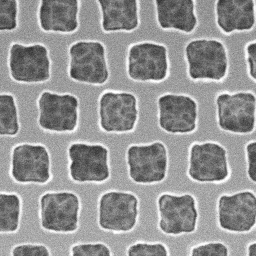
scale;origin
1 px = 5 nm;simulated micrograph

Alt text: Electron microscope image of a regular array of holes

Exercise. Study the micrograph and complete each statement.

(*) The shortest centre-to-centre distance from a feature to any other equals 57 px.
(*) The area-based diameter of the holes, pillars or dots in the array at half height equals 206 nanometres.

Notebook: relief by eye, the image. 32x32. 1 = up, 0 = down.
00111000001100000110000011100000
00111000001110000111000011100000
00111000001110000111000011100000
00111000011110000111100011110001
11111111111111111111111111111111
11111111100001111001111100001110
10000011100001110000011000001110
10000011100001110000011000001110
10000011100001110000011100001110
11000011100001110000011100001110
11111111111111111111111111111111
11111111111111111111111111111111
00111000001110000111000011100000
00111000001100000111000001100000
00111000001110000111000001100000
00111000011110000111000011100000
00111111111111111111100011111001
11111111111111111111111111111111
11000011100001110000011100001110
11000011100001110000011100001110
11000011100001110000011100001110
10000011100000110000011100000110
11000011100001111000111100001111
11111111111111111111111111111111
00111000011110000111000011111000
00011000001100000111000011100000
00011000001100000111000001100000
00111000001100000111000001100000
00111100011110001111000011110001
11111111111111111111111111111111
11111111111001111000111111001110
11000011100000110000011100001110